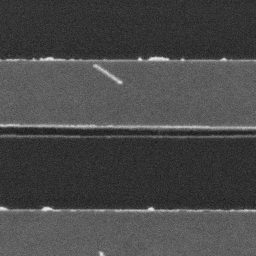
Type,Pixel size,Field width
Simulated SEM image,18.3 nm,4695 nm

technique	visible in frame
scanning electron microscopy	lines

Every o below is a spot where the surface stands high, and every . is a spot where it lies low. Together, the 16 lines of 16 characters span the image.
................
................
................
................
oooooooooooooooo
oooooooooooooooo
oooooooooooooooo
oooooooooooooooo
................
................
................
................
................
oooooooooooooooo
oooooooooooooooo
oooooooooooooooo